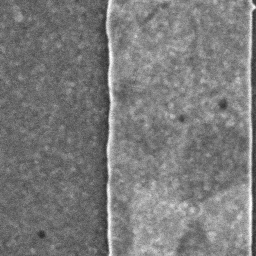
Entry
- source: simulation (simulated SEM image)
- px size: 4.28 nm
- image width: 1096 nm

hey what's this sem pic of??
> one or a few lines or trenches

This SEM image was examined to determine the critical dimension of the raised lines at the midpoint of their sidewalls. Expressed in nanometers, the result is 608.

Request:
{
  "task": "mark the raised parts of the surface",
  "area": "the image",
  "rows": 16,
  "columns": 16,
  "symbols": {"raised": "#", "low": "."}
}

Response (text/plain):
.......#########
.......#########
.......#########
.......#########
.......#########
.......#########
.......#########
.......#########
.......#########
.......#########
.......#########
.......#########
.......#########
.......#########
.......#########
.......#########